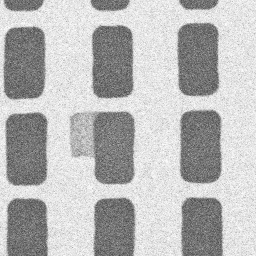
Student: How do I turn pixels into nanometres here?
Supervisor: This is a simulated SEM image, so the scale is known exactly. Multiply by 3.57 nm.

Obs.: holes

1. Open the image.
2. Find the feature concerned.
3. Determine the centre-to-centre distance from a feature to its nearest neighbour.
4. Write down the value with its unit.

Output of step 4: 307 nm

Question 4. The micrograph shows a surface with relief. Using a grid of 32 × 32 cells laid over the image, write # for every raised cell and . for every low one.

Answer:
#....######.....#######....#####
################################
################################
##...#######....#######....#####
#.....######....######.....#####
#.....######.....#####.....#####
#.....######.....#####.....#####
......######.....#####.....#####
......######.....#####.....#####
......######.....#####.....#####
......######.....#####.....#####
#....#######....#######....#####
################################
################################
#....#######....#######....#####
#.....######.....######.....####
#.....######.....######.....####
#.....######.....######.....####
#.....######.....######.....####
#.....######.....#####......####
#.....######.....#####......####
#.....######.....######.....####
#.....######....#######....#####
################################
################################
#.....######.....######.....####
#.....######.....######.....####
#.....######.....######.....####
#.....######.....######.....####
#.....######.....######.....####
#.....######.....######.....####
#.....######.....######.....####